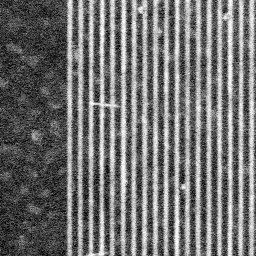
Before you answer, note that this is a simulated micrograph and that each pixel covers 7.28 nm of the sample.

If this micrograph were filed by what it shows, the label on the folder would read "parallel lines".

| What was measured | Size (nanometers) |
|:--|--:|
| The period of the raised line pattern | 78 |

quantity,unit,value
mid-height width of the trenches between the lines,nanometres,53.7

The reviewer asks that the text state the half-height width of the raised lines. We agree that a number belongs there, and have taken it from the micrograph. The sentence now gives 3.38 pixels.